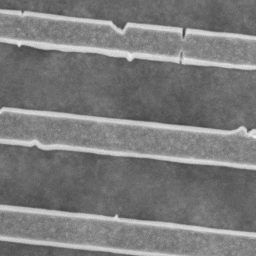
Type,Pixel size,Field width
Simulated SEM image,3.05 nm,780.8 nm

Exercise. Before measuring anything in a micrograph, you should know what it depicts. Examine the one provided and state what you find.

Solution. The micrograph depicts one or a few lines or trenches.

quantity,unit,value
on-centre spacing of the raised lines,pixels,97.5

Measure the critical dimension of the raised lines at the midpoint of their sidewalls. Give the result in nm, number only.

100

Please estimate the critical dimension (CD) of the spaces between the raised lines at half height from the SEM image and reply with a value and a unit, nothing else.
199 nanometers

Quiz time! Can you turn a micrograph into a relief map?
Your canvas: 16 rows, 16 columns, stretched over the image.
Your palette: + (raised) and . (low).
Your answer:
................
+++++++.........
++++++++++++++++
........++++++++
................
................
................
+++++++.........
++++++++++++++++
......++++++++++
................
................
................
++++++..........
++++++++++++++..
.....+++++++++++